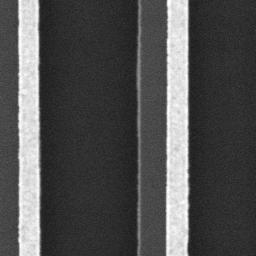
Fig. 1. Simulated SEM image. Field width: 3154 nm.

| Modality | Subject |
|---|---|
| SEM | lines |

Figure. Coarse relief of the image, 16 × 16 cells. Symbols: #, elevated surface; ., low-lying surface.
##.......###....
##.......###....
##.......###....
##.......###....
##.......###....
##.......###....
##.......###....
##.......###....
##.......###....
##.......###....
##.......###....
##.......###....
##.......###....
##.......###....
##.......###....
##.......###....